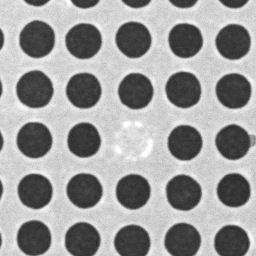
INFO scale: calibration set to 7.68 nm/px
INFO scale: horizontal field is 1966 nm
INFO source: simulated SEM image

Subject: a regular array of holes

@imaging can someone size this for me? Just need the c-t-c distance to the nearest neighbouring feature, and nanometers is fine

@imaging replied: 373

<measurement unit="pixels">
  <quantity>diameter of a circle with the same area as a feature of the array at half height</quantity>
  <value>36.1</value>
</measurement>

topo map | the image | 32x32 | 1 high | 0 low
11110011100011110001110011110001
11111111111111111111111111111111
11111111111111111111111111111111
11100001100011100011110001110001
11000001000001000001100001100001
11000001000001100001100001100001
11100011100011100011110001100001
11111111111111111111111111111111
11111111111111111111111111111111
11100011100011110011100011110011
11000001000001100001100001100001
11000001000001100001100001100001
11000011100011100001100001100001
11110111110111110011111011111011
11111111111111111111111111111111
11100111110111111111111111111111
11000011100011111111100001100001
11000001000001111111100001100001
11000011100011111111100001100001
11100111110111111111110001110001
11111111111111111111111111111111
11111111111111111111111111111111
11100011100011100011100011110001
11000001000001100001100001100001
11000001000001100001100001100001
11100011100011100011100001110001
11111111111111111111111111111111
11111111111111111111111111111111
11000011100011100011100011110011
11000011000001000001100001100001
11000011000001000001100001100001
11100011100011100001100001100001